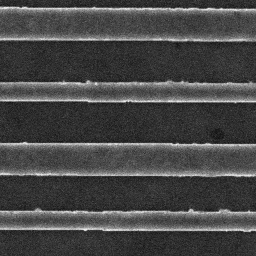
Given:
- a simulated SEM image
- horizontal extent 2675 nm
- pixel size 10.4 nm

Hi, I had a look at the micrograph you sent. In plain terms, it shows lines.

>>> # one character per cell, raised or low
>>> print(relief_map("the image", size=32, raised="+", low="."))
................................
++++++++++++++++++++++++++++++++
++++++++++++++++++++++++++++++++
++++++++++++++++++++++++++++++++
++++++++++++++++++++++++++++++++
................................
................................
................................
................................
................................
+++++++++++++++++++++++++++++++.
++++++++++++++++++++++++++++++++
++++++++++++++++++++++++++++++++
................................
................................
................................
................................
................................
++++++++++++++++++++++++++++++++
++++++++++++++++++++++++++++++++
++++++++++++++++++++++++++++++++
++++++++++++++++++++++++++++++++
................................
................................
................................
................................
+++++++++++..++..++++.......+...
++++++++++++++++++++++++++++++++
++++++++++++++++++++++++++++++++
................................
................................
................................